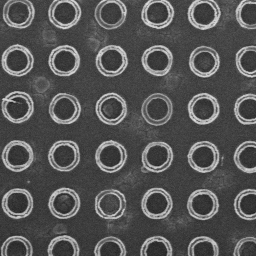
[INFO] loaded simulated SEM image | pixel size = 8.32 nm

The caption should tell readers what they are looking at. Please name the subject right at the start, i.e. a regular array of ring-shaped raised bodies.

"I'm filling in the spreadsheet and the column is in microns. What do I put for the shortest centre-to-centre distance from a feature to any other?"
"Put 0.383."